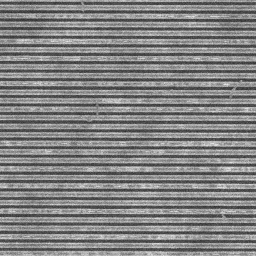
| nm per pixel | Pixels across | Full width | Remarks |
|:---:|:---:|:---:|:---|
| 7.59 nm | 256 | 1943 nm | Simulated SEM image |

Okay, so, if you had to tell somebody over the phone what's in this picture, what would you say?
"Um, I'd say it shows parallel lines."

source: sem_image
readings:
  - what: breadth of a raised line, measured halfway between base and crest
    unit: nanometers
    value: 34.2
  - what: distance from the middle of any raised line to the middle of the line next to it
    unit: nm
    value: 64.5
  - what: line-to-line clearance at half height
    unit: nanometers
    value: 27.5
